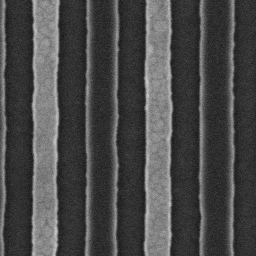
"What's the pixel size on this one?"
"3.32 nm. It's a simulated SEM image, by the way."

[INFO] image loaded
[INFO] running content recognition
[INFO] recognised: lines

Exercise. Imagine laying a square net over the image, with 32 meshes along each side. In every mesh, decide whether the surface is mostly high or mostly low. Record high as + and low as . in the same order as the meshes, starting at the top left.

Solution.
+...+++....++++...+++....++++...
+...+++....++++...+++....++++...
+...+++....++++...+++....++++...
+...+++....++++...+++....++++...
+...+++....++++...+++....++++...
+...+++....++++...+++....++++...
+...+++....++++...+++....++++...
+...+++....++++...+++....++++...
+...+++....++++...+++....++++...
+...+++....++++...+++....++++...
+...+++....++++...+++....++++...
+...+++....++++...+++....++++...
+...+++....++++...+++....++++...
+...+++....++++...+++....++++...
+...+++....++++...+++....++++...
+...+++....++++...+++....++++...
+...+++....++++...+++....++++...
+...+++....++++...+++....++++...
+...+++....++++...+++....++++...
+...+++....++++...+++....++++...
+...+++....++++...+++....++++...
+...+++....++++...+++....++++...
+...+++....++++...+++....++++...
+...+++....++++...+++....++++...
+...+++....++++...+++....++++...
+...+++....++++...+++....++++...
+...+++....++++...+++....++++...
....+++....++++...+++....++++...
....+++....++++...+++....++++...
....+++....+++....+++....++++...
....+++....++++...+++....++++...
....+++....++++...+++....++++...